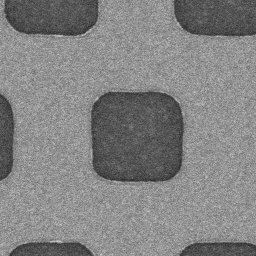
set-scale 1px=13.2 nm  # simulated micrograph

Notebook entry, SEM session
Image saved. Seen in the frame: holes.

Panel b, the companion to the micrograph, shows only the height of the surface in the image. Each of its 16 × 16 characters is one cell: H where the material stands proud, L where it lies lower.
LLLLLLHHHHHLLLLL
HLLLLLHHHHHLLLLL
HHHHHHHHHHHHHHHH
HHHHHHHHHHHHHHHH
HHHHHHHHHHHHHHHH
HHHHHHHHHHHHHHHH
LHHHHHLLLLLHHHHH
LHHHHHLLLLLHHHHH
LHHHHHLLLLLHHHHH
LHHHHHLLLLLHHHHH
LHHHHHLLLLLHHHHH
HHHHHHHHHHHHHHHH
HHHHHHHHHHHHHHHH
HHHHHHHHHHHHHHHH
HHHHHHHHHHHHHHHH
HLLLLHHHHHHHLLLL